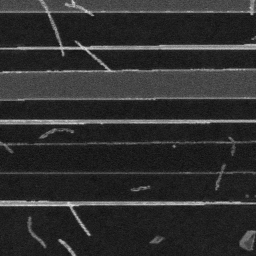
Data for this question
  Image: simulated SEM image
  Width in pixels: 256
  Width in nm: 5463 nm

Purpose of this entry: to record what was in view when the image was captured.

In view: lines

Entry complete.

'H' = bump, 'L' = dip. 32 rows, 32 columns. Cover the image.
HHHHHHHHHHHHHHHHHHHHHHHHHHHHHHHH
HHHHHHHHHHHHHHHHHHHHHHHHHHHHHHHH
LLLLLLLLLLLLLLLLLLLLLLLLLLLLLLLL
LLLLLLLLLLLLLLLLLLLLLLLLLLLLLLLL
LLLLLLLLLLLLLLLLLLLLLLLLLLLLLLLL
LLLLLLLLLLLLLLLLLLLLLLLLLLLLLLLL
LLLLLLLLLLLLLLLLLLLLLLLLLLLLLLLL
LLLLLLLLLLLLLLLLLLLLLLLLLLLLLLLL
LLLLLLLLLLLLLLLLLLLLLLLLLLLLLLLL
HHHHHHHHHHHHHHHHHHHHHHHHHHHHHHHH
HHHHHHHHHHHHHHHHHHHHHHHHHHHHHHHH
HHHHHHHHHHHHHHHHHHHHHHHHHHHHHHHH
LLLLLLLLLLLLLLLLLLLLLLLLLLLLLLLL
LLLLLLLLLLLLLLLLLLLLLLLLLLLLLLLL
LLLLLLLLLLLLLLLLLLLLLLLLLLLLLLLL
LLLLLLLLLLLLLLLLLLLLLLLLLLLLLLLL
LLLLLLLLLLLLLLLLLLLLLLLLLLLLLLLL
LLLLLLLLLLLLLLLLLLLLLLLLLLLLLLLL
HHHHHHHHHHHHHHHHHHHHHHHHHHHHHHHH
HHHHHHHHHHHHHHHHHHHHHHHHHHHHHHHH
HHHHHHHHHHHHHHHHHHHHHHHHHHHHHHHH
HHHHHHHHHHHHHHHHHHHHHHHHHHHHHHHH
LLLLLLLLLLLLLLLLLLLLLLLLLLLLLLLL
LLLLLLLLLLLLLLLLLLLLLLLLLLLLLLLL
LLLLLLLLLLLLLLLLLLLLLLLLLLLLLLLL
HHHHHHLLLLLLLLLLLLLLLLLLLLLLLLLL
LLLLLLLLLLLLLLLLLLLLLLLLLLLLLLLL
LLLLLLLLLLLLLLLLLLLLLLLLLLLLLLLL
LLLLLLLLLLLLLLLLLLLLLLLLLLLLLLLL
LLLLLLLLLLLLLLLLLLLLLLLLLLLLLLLH
LLLLLLLLLLLLLLLLLLLLLLLLLLLLLLHH
LLLLLLLLLLLLLLLLLLLLLLLLLLLLLLLL